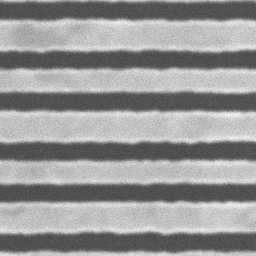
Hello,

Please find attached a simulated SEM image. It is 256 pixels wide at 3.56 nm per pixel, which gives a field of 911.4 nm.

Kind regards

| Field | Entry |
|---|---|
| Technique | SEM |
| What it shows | lines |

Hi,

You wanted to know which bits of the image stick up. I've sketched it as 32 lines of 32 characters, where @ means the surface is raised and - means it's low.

--------------------------------
--------------------------------
--------------------------------
@@@@@@@@@@@@@@@@@@@@@@@@@@@@@@@@
@@@@@@@@@@@@@@@@@@@@@@@@@@@@@@@@
@@@@@@@@@@@@@@@@@@@@@@@@@@@@@@@@
--------------------------------
--------------------------------
--------------------------------
@@@@@@@@@@@@@@@@@@@@@@@@@@@@@@@@
@@@@@@@@@@@@@@@@@@@@@@@@@@@@@@@@
-----------------@--------@@@@@-
--------------------------------
--------------------------------
@@@@@@@@@@@@@@@@@@@@@@@@@@@@@@@@
@@@@@@@@@@@@@@@@@@@@@@@@@@@@@@@@
@@@@@@@@@@@@@@@@@@@@@@@@@@@@@@@@
@@@@@@@@@@@@@@@@@@@@@@@@@@@@@@@@
--------------------------------
--------------------------------
@@@@@@@@@@@@@@@@@@@@@@@@@@@@@@@@
@@@@@@@@@@@@@@@@@@@@@@@@@@@@@@@@
@@@@@@@@@@@@@@@@@@@@@@@@@@@@@@@@
--------------------------------
--------------------------------
--@@@@@-@@@@@@@@@@@@@@@@@@@@@@@@
@@@@@@@@@@@@@@@@@@@@@@@@@@@@@@@@
@@@@@@@@@@@@@@@@@@@@@@@@@@@@@@@@
@@@@@@@@@@@@@@@@@@@@@@@@@@@@@@@@
--------------------------------
--------------------------------
--------------------------------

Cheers